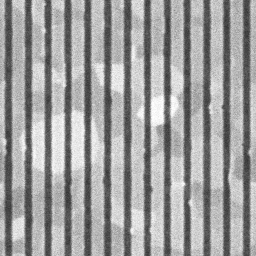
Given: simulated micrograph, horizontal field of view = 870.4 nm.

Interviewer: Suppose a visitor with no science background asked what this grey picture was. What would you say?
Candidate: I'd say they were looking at parallel lines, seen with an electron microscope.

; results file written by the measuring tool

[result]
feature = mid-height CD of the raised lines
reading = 43.3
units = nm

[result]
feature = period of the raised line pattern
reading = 67.3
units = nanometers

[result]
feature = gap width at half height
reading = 24.6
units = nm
